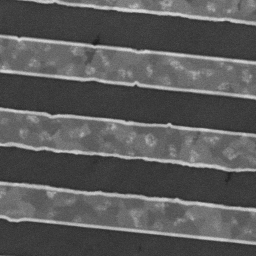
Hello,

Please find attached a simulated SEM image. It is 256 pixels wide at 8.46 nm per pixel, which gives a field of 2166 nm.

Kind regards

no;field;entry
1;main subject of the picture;one or a few lines or trenches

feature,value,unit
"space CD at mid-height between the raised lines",322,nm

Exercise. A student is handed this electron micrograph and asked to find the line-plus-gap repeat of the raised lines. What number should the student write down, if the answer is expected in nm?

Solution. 617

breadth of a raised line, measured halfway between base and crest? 294 nm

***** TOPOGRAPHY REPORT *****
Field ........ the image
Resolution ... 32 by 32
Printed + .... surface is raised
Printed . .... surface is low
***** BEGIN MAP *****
........++++++++++++++++++++++++
...................+++++++++++++
...........................+++++
................................
................................
++++++++++......................
+++++++++++++++++++.............
+++++++++++++++++++++++++++++...
++++++++++++++++++++++++++++++++
......++++++++++++++++++++++++++
................++++++++++++++++
..........................++++++
................................
................................
++++++.+........................
+++++++++++++++++...............
++++++++++++++++++++++++++++....
++++++++++++++++++++++++++++++++
....++++++++++++++++++++++++++++
...............+++++++++++++++++
.......................+++++++++
................................
................................
++++++..........................
++++++++++++++++................
+++++++++++++++++++++++++.......
++++++++++++++++++++++++++++++++
.++.++++++++++++++++++++++++++++
.............+++++++++++++++++++
.......................+++++++++
................................
................................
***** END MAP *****